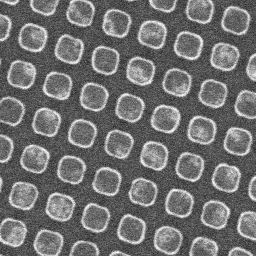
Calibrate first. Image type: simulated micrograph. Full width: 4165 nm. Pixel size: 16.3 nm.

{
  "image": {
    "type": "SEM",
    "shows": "a regular array of raised bodies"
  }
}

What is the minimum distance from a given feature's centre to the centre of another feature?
612 nanometres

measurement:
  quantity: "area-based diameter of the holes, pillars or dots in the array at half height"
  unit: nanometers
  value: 438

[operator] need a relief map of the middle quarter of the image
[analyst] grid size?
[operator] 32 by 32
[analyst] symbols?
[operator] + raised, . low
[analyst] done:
.......++++++...++++++..........
........+++++...++++++.....++...
..........+.....++++++....+++++.
+...............++++++...++++++.
++...............++++....+++++++
++...++++................+++++++
+....+++++...............++++++.
+...+++++++................+++..
....+++++++...+++++.............
....++++++....+++++.............
.....+++++...+++++++....+.......
.......++....+++++++...+++++....
.............++++++...+++++++...
..............+++++...+++++++...
...+++................+++++++...
..+++++...............++++++...+
..++++++................+++....+
.+++++++...++++................+
.+++++++...++++++...............
..+++++....++++++...............
....++....+++++++...+++++.......
..........++++++....++++++......
...........+++++...+++++++....++
+++................+++++++...+++
+++++..............++++++....+++
+++++................++++...++++
+++++....+++................++++
+++++...++++++..............++++
++++....++++++................++
.+++...+++++++....++++..........
.......+++++++...++++++.........
........+++++....++++++....+....